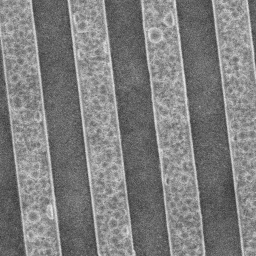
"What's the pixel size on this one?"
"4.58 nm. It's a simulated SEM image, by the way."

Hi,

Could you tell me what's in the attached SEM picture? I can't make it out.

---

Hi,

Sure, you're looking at one or a few lines or trenches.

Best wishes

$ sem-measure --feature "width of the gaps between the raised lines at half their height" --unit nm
171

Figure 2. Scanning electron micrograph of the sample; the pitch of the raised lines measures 328 nanometres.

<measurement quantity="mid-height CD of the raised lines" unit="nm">158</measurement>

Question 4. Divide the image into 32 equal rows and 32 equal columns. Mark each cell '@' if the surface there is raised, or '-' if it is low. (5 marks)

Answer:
@@@@-----@@@@-----@@@@-----@@@@-
@@@@-----@@@@-----@@@@-----@@@@-
@@@@-----@@@@-----@@@@-----@@@@-
@@@@-----@@@@-----@@@@-----@@@@-
@@@@-----@@@@-----@@@@-----@@@@-
@@@@@----@@@@@----@@@@-----@@@@@
@@@@@----@@@@@----@@@@@----@@@@@
@@@@@----@@@@@----@@@@@-----@@@@
-@@@@-----@@@@-----@@@@-----@@@@
-@@@@-----@@@@-----@@@@-----@@@@
-@@@@-----@@@@-----@@@@-----@@@@
-@@@@-----@@@@-----@@@@-----@@@@
-@@@@-----@@@@-----@@@@-----@@@@
-@@@@-----@@@@@----@@@@-----@@@@
-@@@@@----@@@@@----@@@@@----@@@@
-@@@@@----@@@@@----@@@@@----@@@@
--@@@@----@@@@@-----@@@@-----@@@
--@@@@-----@@@@-----@@@@-----@@@
--@@@@-----@@@@-----@@@@-----@@@
--@@@@-----@@@@-----@@@@-----@@@
--@@@@-----@@@@-----@@@@-----@@@
--@@@@-----@@@@@----@@@@-----@@@
--@@@@@----@@@@@----@@@@@----@@@
--@@@@@----@@@@@----@@@@@----@@@
--@@@@@----@@@@@-----@@@@-----@@
---@@@@-----@@@@-----@@@@-----@@
---@@@@-----@@@@-----@@@@-----@@
---@@@@-----@@@@-----@@@@-----@@
---@@@@-----@@@@-----@@@@-----@@
---@@@@-----@@@@-----@@@@-----@@
---@@@@@----@@@@@----@@@@-----@@
---@@@@@----@@@@@----@@@@@----@@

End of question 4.